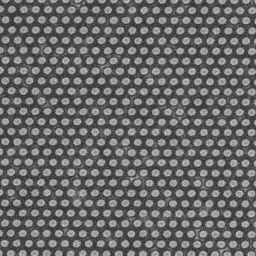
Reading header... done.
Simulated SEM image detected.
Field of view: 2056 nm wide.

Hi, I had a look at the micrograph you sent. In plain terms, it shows a regular array of raised bodies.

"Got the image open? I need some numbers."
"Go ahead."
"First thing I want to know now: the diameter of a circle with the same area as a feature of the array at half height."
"54.3 nm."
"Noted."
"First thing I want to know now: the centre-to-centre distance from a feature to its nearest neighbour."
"93.2 nanometres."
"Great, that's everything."